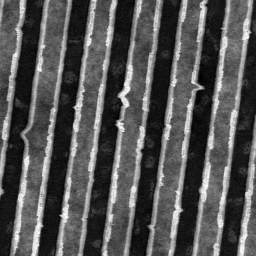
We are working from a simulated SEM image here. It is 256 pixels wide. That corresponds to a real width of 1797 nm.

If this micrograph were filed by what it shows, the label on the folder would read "parallel lines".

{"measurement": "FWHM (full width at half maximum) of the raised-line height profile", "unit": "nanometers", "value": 170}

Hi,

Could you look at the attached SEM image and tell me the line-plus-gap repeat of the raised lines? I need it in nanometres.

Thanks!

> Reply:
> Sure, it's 316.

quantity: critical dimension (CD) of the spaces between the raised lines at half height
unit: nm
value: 145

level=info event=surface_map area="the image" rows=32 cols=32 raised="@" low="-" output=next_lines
@@@---@@@--@@@---@@@---@@@--@@@-
@@@---@@@--@@@---@@@---@@@--@@@-
@@@--@@@---@@@---@@@--@@@---@@@-
@@---@@@---@@@---@@@--@@@---@@@-
@@@--@@@---@@@---@@@--@@@---@@@-
@@---@@@---@@@--@@@---@@@---@@@-
@@---@@@---@@@--@@@---@@@---@@@-
@@---@@@--@@@---@@@---@@@---@@--
@@---@@@--@@@---@@@---@@@--@@@--
@@--@@@@--@@@---@@@---@@@--@@@--
@@--@@@---@@@---@@@--@@@@--@@@--
@@--@@@---@@@--@@@@--@@@---@@@--
@---@@@---@@@--@@@---@@@---@@@--
@---@@@--@@@@--@@@---@@@---@@@--
@---@@@--@@@@--@@@---@@@---@@@--
@---@@@--@@@---@@@---@@@--@@@---
@--@@@@--@@@---@@@---@@@--@@@---
@--@@@---@@@---@@@--@@@---@@@---
@--@@@---@@@---@@@--@@@---@@@---
---@@@---@@@---@@---@@@---@@@---
---@@@---@@@--@@@---@@@---@@@--@
---@@@---@@@--@@@---@@@---@@@--@
---@@@--@@@---@@@---@@@--@@@---@
---@@@--@@@---@@@---@@@--@@@---@
--@@@---@@@---@@@--@@@@--@@@---@
--@@@---@@@---@@@--@@@---@@@---@
--@@@---@@@---@@@--@@@---@@@---@
--@@@---@@@--@@@---@@@---@@@--@@
--@@@---@@@--@@@---@@@---@@@--@@
--@@@---@@---@@@---@@@--@@@---@@
--@@@--@@@---@@@---@@@--@@@---@@
--@@@--@@@---@@@---@@@--@@@---@@